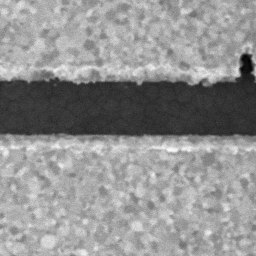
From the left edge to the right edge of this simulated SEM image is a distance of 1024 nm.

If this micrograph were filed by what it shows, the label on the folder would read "one or a few lines or trenches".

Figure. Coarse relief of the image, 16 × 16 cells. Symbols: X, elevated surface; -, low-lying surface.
XXXXXXXXXXXXXXXX
XXXXXXXXXXXXXXXX
XXXXXXXXXXXXXXXX
XXXXXXXXXXXXXXX-
XX--X--XX--XXXX-
----------------
----------------
----------------
----------------
XXXXXXXXXXXXXXXX
XXXXXXXXXXXXXXXX
XXXXXXXXXXXXXXXX
XXXXXXXXXXXXXXXX
XXXXXXXXXXXXXXXX
XXXXXXXXXXXXXXXX
XXXXXXXXXXXXXXXX